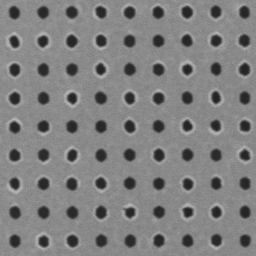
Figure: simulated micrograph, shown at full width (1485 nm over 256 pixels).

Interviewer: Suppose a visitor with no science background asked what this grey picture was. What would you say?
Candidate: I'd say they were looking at a regular array of holes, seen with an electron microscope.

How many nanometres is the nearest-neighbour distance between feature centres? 164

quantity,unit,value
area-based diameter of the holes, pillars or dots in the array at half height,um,0.0683